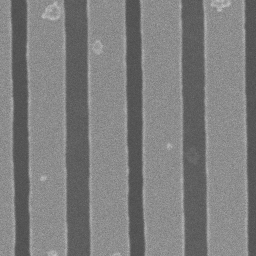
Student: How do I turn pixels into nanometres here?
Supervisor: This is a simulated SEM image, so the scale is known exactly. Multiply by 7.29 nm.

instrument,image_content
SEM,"lines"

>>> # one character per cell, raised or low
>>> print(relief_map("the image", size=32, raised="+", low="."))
+..+++++...+++++..+++++..++++++.
+..+++++...+++++..+++++..++++++.
+..+++++...+++++..+++++...+++++.
+..+++++...+++++..+++++...+++++.
+..+++++...+++++..+++++...+++++.
+..+++++...+++++..+++++...+++++.
+..+++++...+++++..+++++...+++++.
+..+++++...+++++..+++++...+++++.
+..+++++...+++++..+++++...+++++.
+..+++++...+++++..+++++...+++++.
+...++++...+++++..+++++...+++++.
+...++++...+++++..+++++...+++++.
++..++++...+++++..+++++...+++++.
++..++++...+++++..+++++...+++++.
++..++++...+++++..+++++...+++++.
++..++++...+++++..+++++...+++++.
+...++++...+++++..+++++...+++++.
++..++++...+++++..+++++...+++++.
++..++++...+++++..+++++...+++++.
+...++++...+++++..+++++...+++++.
++..++++...+++++..+++++...+++++.
++..++++...+++++..+++++...+++++.
++..++++...+++++..+++++...+++++.
++..++++...+++++..+++++...+++++.
++..++++...+++++..+++++...+++++.
++..++++...+++++..+++++...+++++.
++..++++...+++++..+++++...+++++.
++..++++...+++++..+++++...+++++.
++..++++...+++++..+++++...+++++.
++..++++...+++++..+++++...+++++.
++..++++...+++++..+++++...+++++.
++..++++...+++++..+++++...+++++.